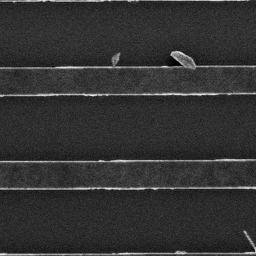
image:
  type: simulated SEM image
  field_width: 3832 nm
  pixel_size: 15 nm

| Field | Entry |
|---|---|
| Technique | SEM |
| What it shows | lines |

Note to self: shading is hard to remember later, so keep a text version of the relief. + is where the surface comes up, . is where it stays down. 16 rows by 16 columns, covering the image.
................
................
................
...........+....
++++++++++++++++
++++++++++++++++
................
................
................
................
++++++++++++++++
++++++++++++++++
................
................
................
................